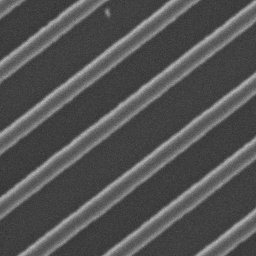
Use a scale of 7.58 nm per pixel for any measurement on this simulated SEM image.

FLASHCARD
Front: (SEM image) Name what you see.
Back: lines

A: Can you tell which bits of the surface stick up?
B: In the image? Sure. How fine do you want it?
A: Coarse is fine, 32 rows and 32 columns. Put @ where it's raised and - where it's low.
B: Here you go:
@@-------@@@@--------@@@-------@
@-------@@@---------@@@-------@@
-------@@@--------@@@@-------@@@
-----@@@@--------@@@-------@@@@-
----@@@@--------@@@-------@@@@--
---@@@--------@@@@-------@@@----
--@@@--------@@@@------@@@@-----
@@@@--------@@@-------@@@@------
@@---------@@@-------@@@--------
@--------@@@@-------@@@--------@
--------@@@-------@@@@--------@@
-------@@@-------@@@@--------@@@
-----@@@@-------@@@---------@@@-
----@@@@-------@@@--------@@@@--
---@@@-------@@@@--------@@@----
--@@@-------@@@---------@@@-----
@@@@------@@@@--------@@@@------
@@-------@@@@--------@@@@-------
@-------@@@---------@@@-------@@
-------@@@---------@@@-------@@@
-----@@@@--------@@@@-------@@@-
----@@@@--------@@@-------@@@@--
---@@@---------@@@-------@@@@---
--@@@--------@@@@-------@@@-----
@@@@--------@@@@-------@@@------
@@---------@@@-------@@@@-------
@--------@@@@-------@@@--------@
--------@@@@-------@@@--------@@
-------@@@-------@@@@--------@@@
------@@@-------@@@@--------@@@-
----@@@@-------@@@--------@@@@--
---@@@-------@@@@--------@@@@---